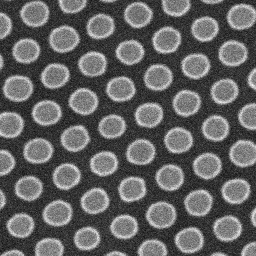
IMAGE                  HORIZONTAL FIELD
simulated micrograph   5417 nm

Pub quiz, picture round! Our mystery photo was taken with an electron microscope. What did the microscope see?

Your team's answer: a regular array of raised bodies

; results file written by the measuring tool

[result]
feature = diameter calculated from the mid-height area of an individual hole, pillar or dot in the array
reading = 529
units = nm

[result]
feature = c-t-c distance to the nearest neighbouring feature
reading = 0.802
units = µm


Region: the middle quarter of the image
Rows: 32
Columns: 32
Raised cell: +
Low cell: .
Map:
....++++++.............++.....++
+...++++++...........+++++....++
+....++++............++++++....+
+............++.....+++++++.....
............+++++...+++++++.....
...........++++++....+++++......
....++.....+++++++..............
..+++++....++++++............+++
..++++++....++++............++++
.+++++++....................++++
..++++++............++++...+++++
...++++............+++++....++++
..................++++++.....+++
..........++++....++++++........
.........++++++...++++++........
.........++++++.....++..........
.++++....++++++............+++..
++++++....++++............+++++.
++++++...................+++++++
++++++............+++....+++++++
+++++............+++++....+++++.
..++............++++++....++++..
.........+++....++++++..........
.......++++++...++++++..........
.......++++++....++++...........
++.....++++++............++.....
+++....++++++...........+++++...
++++.....++............+++++++..
++++...................+++++++..
+++............+++++...+++++++..
++............++++++....+++++...
.......++.....++++++............